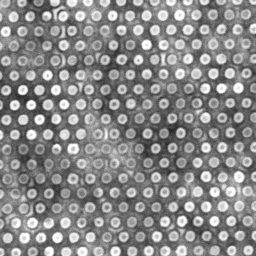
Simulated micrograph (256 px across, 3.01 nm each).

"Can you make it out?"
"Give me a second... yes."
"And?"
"a regular array of raised bodies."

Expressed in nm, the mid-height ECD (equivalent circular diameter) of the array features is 27.4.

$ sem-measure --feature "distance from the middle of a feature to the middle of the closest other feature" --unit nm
49.2